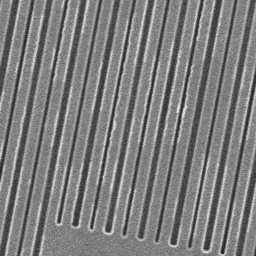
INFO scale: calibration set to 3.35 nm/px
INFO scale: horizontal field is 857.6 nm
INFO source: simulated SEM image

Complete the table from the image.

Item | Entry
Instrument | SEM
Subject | parallel lines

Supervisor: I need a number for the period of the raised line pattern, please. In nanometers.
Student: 55.6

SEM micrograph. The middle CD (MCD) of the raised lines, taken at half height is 36.6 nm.